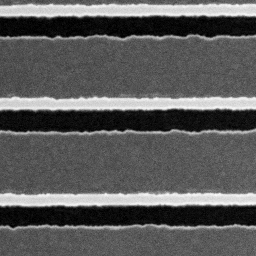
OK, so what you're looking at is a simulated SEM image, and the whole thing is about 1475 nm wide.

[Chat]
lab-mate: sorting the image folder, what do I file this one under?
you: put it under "lines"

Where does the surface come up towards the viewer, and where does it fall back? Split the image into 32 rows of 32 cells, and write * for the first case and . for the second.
********************************
********************************
................................
................................
...........***....*....**......*
********************************
********************************
********************************
********************************
********************************
********************************
********************************
********************************
********************************
................................
................................
**....*.....*****.**.**..*******
********************************
********************************
********************************
********************************
********************************
********************************
********************************
********************************
********************************
................................
................................
********************************
********************************
********************************
********************************